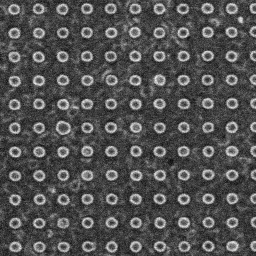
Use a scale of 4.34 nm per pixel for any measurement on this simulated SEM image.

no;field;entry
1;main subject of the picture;a regular array of raised bodies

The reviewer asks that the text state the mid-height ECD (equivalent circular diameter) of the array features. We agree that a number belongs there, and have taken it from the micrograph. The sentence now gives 44.9 nm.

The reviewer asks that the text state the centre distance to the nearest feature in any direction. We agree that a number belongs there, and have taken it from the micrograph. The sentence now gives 102 nanometres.